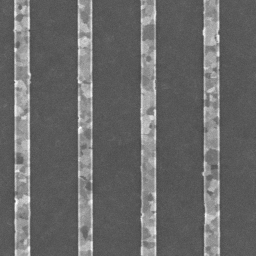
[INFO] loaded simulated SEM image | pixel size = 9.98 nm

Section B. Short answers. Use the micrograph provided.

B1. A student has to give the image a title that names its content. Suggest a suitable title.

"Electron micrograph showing one or a few lines or trenches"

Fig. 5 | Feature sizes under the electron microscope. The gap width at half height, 497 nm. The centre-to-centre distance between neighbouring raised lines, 630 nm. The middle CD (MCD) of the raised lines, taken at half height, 0.136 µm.